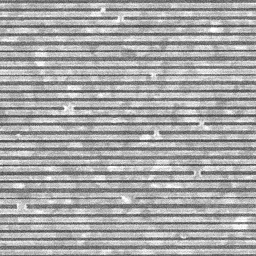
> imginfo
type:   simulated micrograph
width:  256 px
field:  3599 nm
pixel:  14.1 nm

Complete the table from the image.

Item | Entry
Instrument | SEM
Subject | parallel lines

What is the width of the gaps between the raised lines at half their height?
56.2 nm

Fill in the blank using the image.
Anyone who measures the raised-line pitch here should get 115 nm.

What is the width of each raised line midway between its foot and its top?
56.2 nm